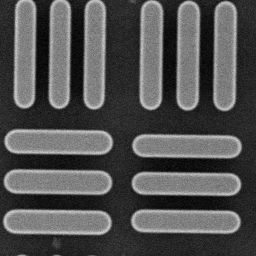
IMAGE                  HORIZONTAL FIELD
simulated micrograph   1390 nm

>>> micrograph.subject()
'groups of lines, slits or small figures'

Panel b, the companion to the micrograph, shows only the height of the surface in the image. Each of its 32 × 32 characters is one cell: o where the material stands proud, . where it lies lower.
..oo...oo..oo.....oo...o...oo...
..oo..ooo..oo.....oo..ooo..oo...
..oo..ooo..oo.....oo..ooo..oo...
..oo..ooo..oo.....oo..ooo..oo...
..oo..ooo..oo.....oo..ooo..oo...
..oo..ooo..oo.....oo..ooo..oo...
..oo..ooo..oo.....oo..ooo..oo...
..oo..ooo..oo.....oo..ooo..oo...
..oo..ooo..oo.....oo..ooo..oo...
..oo..ooo..oo.....oo..ooo..oo...
..oo..ooo..oo.....oo..ooo..oo...
..oo..ooo..oo.....oo..ooo..oo...
..oo..ooo..oo.....oo..ooo..oo...
.......o...o......o....o...oo...
................................
................................
.oooooooooooo...................
.ooooooooooooo...ooooooooooooo..
.ooooooooooooo...ooooooooooooo..
..................ooooooooooo...
................................
.oooooooooooo...................
.ooooooooooooo...ooooooooooooo..
.ooooooooooooo...ooooooooooooo..
................................
................................
.oooooooooooo....oooooooooooo...
.ooooooooooooo...ooooooooooooo..
.ooooooooooooo...ooooooooooooo..
................................
................................
................................